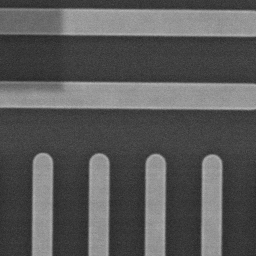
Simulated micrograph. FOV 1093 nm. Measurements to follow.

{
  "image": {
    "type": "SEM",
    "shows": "groups of lines, slits or small figures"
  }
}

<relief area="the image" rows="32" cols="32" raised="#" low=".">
................................
################################
################################
################################
................................
................................
................................
................................
................................
................................
################################
################################
################################
...................#############
................................
................................
................................
................................
................................
.....#......#......#......#.....
....###....###....###....###....
....###....###....###....###....
....###....###....###....###....
....###....###....###....###....
....###....###....###....###....
....###....##.....###....###....
....###....##.....###....###....
....###....##.....###....###....
....###....##.....###....###....
....##.....##.....###....###....
....##.....##.....###....###....
....##.....##.....###....###....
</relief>